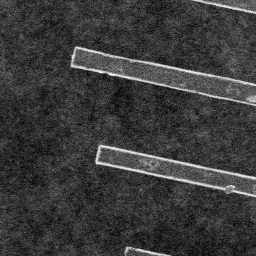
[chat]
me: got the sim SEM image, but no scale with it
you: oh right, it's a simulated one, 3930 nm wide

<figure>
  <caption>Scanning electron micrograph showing one or a few lines or trenches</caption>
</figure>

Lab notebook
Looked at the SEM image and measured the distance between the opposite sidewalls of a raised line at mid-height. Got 285 nanometers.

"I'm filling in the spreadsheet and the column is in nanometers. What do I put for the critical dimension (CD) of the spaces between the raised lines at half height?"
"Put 1100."